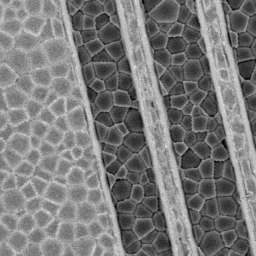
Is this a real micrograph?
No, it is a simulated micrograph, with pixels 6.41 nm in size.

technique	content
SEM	one or a few lines or trenches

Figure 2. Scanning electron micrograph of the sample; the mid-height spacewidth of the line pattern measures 0.352 micrometres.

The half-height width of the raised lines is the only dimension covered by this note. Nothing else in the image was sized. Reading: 0.115 µm